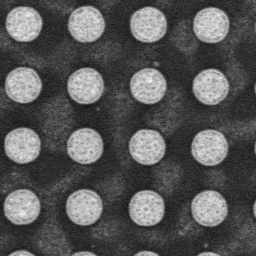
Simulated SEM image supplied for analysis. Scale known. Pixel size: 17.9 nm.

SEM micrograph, a regular array of raised bodies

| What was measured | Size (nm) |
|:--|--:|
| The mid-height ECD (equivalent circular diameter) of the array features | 625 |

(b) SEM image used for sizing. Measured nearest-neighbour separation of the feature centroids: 1090 nanometers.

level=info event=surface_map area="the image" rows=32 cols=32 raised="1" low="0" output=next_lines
00000000000000000000000000000000
01110000011100000111000001110000
01111000011110001111100011110000
01111000011110001111100011110000
00110000011100000111000001110000
00000000000000000000000000000000
00000000000000000000000000000000
00000000000000000000000000000000
00000000000000000000000000000000
01111000011100000111000001110000
01111000011110001111100011110000
01111000011110001111000011110000
00110000011100000111000001110000
00000000000000000000000000000000
00000000000000000000000000000000
00000000000000000000000000000000
01110000011100000110000001100000
01111000011110001111000011110000
01111000111110001111100011110000
01111000011100000111000011110000
00000000000000000000000001100000
00000000000000000000000000000000
00000000000000000000000000000000
00000000000000000000000000000000
01110000011100000111000001110000
01111000111110001111000011110000
01111000111110001111000011110000
01110000011100000111000001110000
00000000000000000000000000000000
00000000000000000000000000000000
00000000000000000000000000000000
00100000000000000000000000000000